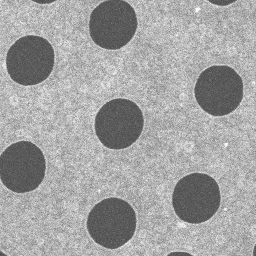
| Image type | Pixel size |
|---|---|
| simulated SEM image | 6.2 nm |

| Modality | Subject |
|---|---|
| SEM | holes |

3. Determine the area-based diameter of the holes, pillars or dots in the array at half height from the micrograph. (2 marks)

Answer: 311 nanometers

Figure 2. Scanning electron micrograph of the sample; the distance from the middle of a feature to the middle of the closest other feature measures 616 nm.